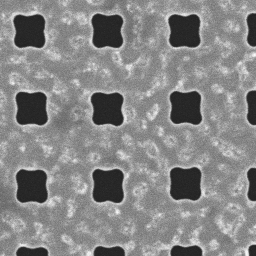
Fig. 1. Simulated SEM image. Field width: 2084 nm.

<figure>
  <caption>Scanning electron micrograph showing a regular array of holes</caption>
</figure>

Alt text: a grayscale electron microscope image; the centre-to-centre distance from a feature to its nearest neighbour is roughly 625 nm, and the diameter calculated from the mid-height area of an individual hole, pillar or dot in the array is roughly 286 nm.